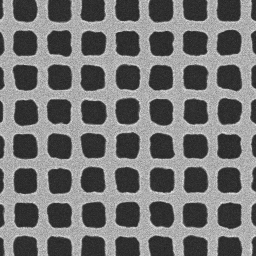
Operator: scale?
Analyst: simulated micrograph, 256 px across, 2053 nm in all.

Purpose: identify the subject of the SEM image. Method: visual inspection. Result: a regular array of holes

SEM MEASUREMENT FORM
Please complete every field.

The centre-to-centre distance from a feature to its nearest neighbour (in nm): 269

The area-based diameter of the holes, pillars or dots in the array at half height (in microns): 0.212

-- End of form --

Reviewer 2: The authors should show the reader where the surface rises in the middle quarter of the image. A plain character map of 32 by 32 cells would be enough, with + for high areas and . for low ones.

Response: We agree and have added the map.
.++++...++++++....++++...++++++.
..++......+++......+++.....+++..
..++......+++......++......+++..
..++......+++......++......+++..
..++......+++......++......+++..
..+++.....+++......++......+++..
+++++...++++++++..++++....++++++
++++++++++++++++++++++++++++++++
++++++++++++++++++++++++++++++++
.++++....++++......+++.....+++..
..++......+++......++......+++..
..++.......++......++......+++..
..++.......++......++......+++..
..+++......++......++......+++..
.++++.....++++....++++.....++++.
+++++++++++++++++++++++++.++++++
++++++++++++++++++++++++++++++++
+++++....+++++....+++++..+++++++
.+++......+++......++......+++..
..++......+++......++......+++..
..++......+++......++......+++..
..+++.....+++......++.......++..
..+++.....+++......+++......++..
.+++++...+++++....++++.....++++.
++++++++++++++++++++++++++++++++
++++++++++++++++++++++++++++++++
.++++.....+++.....++++.....+++..
..++......+++......++.......++..
..++......+++......++.......++..
..++......+++......++.......++..
..++......+++......+++......++..
..+++.....++++.....+++.....+++..